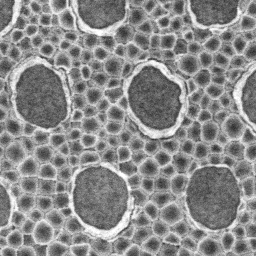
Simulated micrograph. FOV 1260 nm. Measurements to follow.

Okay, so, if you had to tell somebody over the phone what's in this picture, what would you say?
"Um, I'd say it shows holes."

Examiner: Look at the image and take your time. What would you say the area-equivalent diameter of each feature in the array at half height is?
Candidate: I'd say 294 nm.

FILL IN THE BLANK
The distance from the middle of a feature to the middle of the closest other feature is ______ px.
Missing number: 113